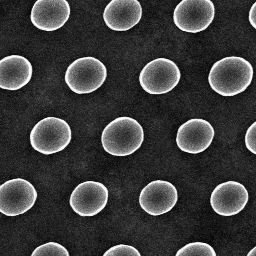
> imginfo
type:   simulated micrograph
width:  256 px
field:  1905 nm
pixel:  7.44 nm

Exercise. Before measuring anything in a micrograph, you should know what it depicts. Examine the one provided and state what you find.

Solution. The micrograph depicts a regular array of raised bodies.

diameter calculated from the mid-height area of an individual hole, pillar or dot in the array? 269 nm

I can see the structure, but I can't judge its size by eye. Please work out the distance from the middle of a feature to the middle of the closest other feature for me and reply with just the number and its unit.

69.7 pixels